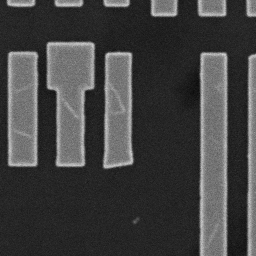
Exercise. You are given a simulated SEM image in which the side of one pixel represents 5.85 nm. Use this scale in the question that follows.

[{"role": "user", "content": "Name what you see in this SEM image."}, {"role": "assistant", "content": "wiring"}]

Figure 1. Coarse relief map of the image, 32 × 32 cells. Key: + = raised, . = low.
.+++...+++...+++...+++...+++...+
...................+++...+++...+
................................
................................
................................
......+++++.....................
......++++++....................
.++++.++++++.+++.........+++...+
.++++.++++++.+++.........+++...+
.++++.++++++.+++.........+++...+
.++++.++++++.+++.........+++...+
.++++..++++..+++.........+++...+
.++++..+++...+++.........+++...+
.++++..+++...+++.........+++...+
.++++..+++...+++.........+++...+
.++++..+++...+++.........+++...+
.++++..+++...+++.........+++...+
.++++..+++...+++.........+++...+
.++++..+++...+++.........+++...+
.++++..+++...++++........+++...+
.+++...+++...+++.........+++...+
.........................+++...+
.........................+++...+
.........................+++...+
.........................+++...+
.........................+++...+
.........................+++...+
.........................+++...+
.........................+++...+
.........................+++...+
.........................+++...+
.........................+++...+